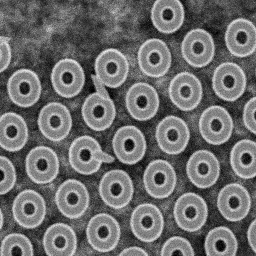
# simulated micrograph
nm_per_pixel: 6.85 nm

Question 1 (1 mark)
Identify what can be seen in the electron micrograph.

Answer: a regular array of ring-shaped raised bodies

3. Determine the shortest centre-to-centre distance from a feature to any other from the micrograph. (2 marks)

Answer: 305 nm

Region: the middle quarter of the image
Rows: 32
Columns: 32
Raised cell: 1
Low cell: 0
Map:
11110000110001110001111111000000
11110000111001110000111110000000
00111000111001110000011110000110
00111001111111100000000000001111
00111001111111000000000000011111
11111000110110000111100000011101
11110000110000001111111000111000
11100000111000001111111000011000
00000011111000001100011000011101
00000111111100001100011000011111
00000111001100001100011000001111
10000110001110001111111000000000
10000110001110000111111000000000
11000111011100000011100000110000
11000011111100000000000011111100
11000011111000000000000011111100
10000000000000111100000111001110
10000000000001111110000111000110
00001110000001110111000111000110
00011111000011100011000011001110
00111111100011100011000011111100
00110011100001100111000001111000
00110001111001111111000000000000
00110001111100111110000000000000
00111011100100011100000110000001
00111111100000000000011111100001
00011111000000000000011111100001
00000000000111100000111001110001
00000000001111110000110001110000
11110000011111111000111001110000
11111000011100011000011111110000
11111100011000011000011111100000